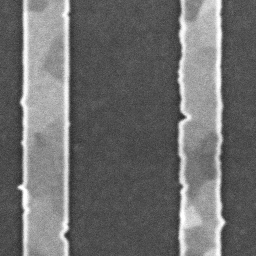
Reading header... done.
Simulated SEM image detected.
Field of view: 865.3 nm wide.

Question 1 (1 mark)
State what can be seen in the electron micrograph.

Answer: one or a few lines or trenches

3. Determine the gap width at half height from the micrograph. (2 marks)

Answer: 0.389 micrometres